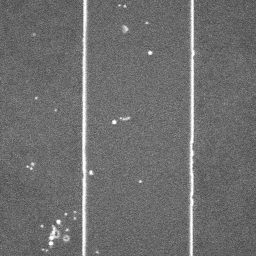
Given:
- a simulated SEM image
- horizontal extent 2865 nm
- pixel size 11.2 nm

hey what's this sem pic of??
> lines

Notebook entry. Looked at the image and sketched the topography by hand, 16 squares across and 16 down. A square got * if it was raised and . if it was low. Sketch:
.....*******....
.....*******....
.....*******....
.....*******....
.....*******....
.....*******....
.....*******....
.....*******....
.....*******....
.....*******....
.....*******....
.....*******....
.....*******....
.....*******....
.....*******....
.....*******....